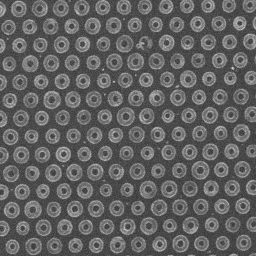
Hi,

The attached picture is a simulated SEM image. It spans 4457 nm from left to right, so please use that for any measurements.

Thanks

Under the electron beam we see a regular array of ring-shaped raised bodies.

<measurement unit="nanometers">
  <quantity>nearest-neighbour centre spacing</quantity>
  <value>362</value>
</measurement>